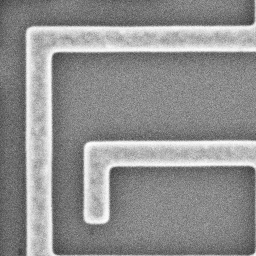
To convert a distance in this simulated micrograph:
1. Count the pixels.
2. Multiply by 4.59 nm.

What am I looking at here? wiring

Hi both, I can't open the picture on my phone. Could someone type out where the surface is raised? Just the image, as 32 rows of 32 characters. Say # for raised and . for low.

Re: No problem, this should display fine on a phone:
................................
................................
................................
....############################
...#############################
...#############################
...####.........................
...###..........................
...###..........................
...###..........................
...###..........................
...###..........................
...###..........................
...###..........................
...###..........................
...###..........................
...###..........................
...###..........................
...###.....#####################
...###.....#####################
...###.....#####################
...###.....###..................
...###.....###..................
...###.....###..................
...###.....###..................
...###.....###..................
...###.....###..................
...###.....##...................
...###..........................
...###..........................
...###..........................
...####.........................